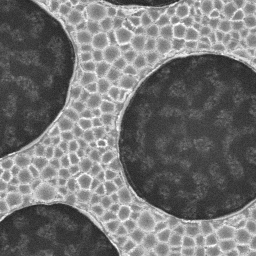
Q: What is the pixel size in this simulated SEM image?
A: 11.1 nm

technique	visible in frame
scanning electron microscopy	holes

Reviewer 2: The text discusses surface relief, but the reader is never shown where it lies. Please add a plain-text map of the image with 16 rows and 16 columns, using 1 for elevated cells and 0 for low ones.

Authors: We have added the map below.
0001111111111111
0000111111111111
0000111111111111
0000011111110011
0000011111000000
0000111110000000
0000111100000000
0001111100000000
0001111000000000
0111111000000000
1111111100000000
1111111100000000
1111111110000000
0000011111100011
0000001111111111
0000000111111111